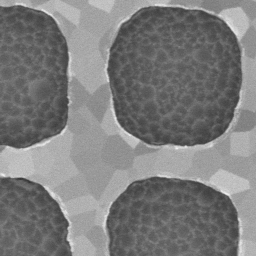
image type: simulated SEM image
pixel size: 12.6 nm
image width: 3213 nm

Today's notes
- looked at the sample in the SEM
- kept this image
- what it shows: holes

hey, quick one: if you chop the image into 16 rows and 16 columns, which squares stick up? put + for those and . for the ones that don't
..+++++++..+++++
....++++......++
....+++........+
....+++........+
....+++........+
....+++........+
....+++........+
....+++.......++
...+++++......++
++++++++++++++++
++++++++++++++++
..++++++.....+++
...++++.......++
....+++........+
....+++........+
....+++........+